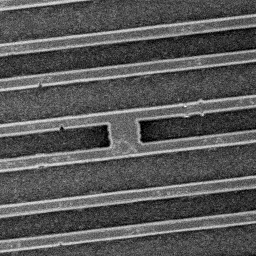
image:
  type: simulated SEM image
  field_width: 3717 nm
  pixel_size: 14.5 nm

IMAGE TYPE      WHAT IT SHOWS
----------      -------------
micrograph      parallel lines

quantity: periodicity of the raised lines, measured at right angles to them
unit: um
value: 0.567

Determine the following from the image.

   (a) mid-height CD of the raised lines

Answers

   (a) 159 nanometres